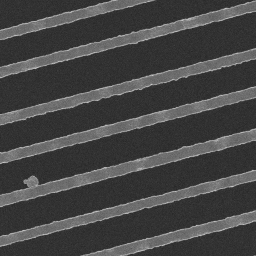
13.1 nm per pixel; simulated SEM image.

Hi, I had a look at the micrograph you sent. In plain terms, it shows parallel lines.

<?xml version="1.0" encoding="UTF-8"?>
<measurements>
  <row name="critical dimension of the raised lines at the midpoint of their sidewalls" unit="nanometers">132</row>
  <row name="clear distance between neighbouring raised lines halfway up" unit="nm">383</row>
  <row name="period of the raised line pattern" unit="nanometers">530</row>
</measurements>